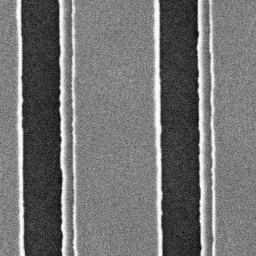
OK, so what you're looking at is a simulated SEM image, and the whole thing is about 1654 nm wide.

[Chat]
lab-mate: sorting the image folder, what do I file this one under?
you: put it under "lines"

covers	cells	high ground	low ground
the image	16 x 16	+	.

+....+++++...+++
+....+++++...+++
+....+++++...+++
+....+++++...+++
+....+++++...+++
+....+++++...+++
+....+++++...+++
+....+++++...+++
+....+++++...+++
+....+++++...+++
+....+++++...+++
+....+++++...+++
+....+++++...+++
+....+++++...+++
+....+++++...+++
+....+++++...+++